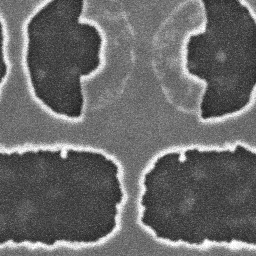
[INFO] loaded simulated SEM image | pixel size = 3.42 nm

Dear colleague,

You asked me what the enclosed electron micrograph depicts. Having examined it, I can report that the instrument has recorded one or a few lines or trenches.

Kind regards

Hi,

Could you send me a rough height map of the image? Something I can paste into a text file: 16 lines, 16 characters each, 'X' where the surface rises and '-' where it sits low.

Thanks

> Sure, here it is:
XXX--XXXXXXXX--X
XX----XXXXXXX---
XX----XXXXXX----
XX----XXXXXX----
XX----XXXXXX----
XX---XXXXXXXX---
XXX--XXXXXXXX---
XXXXXXXXXXXXXXXX
XXXXXXXXXXXXXXXX
------XXXXX-----
-------XX-------
--------X-------
--------X-------
-------XX-------
-------XXX------
XXXXXXXXXXXXXXXX